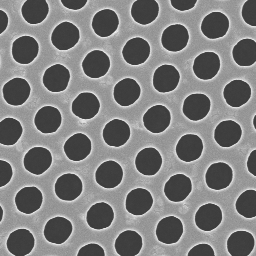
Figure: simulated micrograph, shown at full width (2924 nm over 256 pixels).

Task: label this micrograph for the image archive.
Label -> a regular array of holes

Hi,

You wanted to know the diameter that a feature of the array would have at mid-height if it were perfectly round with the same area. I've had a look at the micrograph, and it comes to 314 nm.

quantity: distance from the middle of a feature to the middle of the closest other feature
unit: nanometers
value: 465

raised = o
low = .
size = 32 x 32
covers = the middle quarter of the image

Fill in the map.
ooooo.......oooooooooooo...ooooo
.oooo......oooooooooooo.....oooo
.oooo.....oooooooooooo.......ooo
.oooooo..ooooooooooooo.......ooo
.ooooooooooooo....oooo.......ooo
.oooooooooooo......ooo......oooo
oooooooooooo.......oooo....ooooo
oooo...ooooo.......ooooooooooooo
ooo.....ooooo......oooooooooooo.
oo.......oooo.....oooooooooooo..
oo.......oooooo.oooooo...ooooo..
oo.......oooooooooooo.....oooo..
ooo.....oooooooooooo.......ooo..
oooo...ooooooooooooo.......oooo.
ooooooooooo....ooooo......oooooo
oooooooooo......oooo......oooooo
oooooooooo.......oooo....ooooooo
ooo..ooooo.......ooooooooooooooo
o.....oooo......ooooooooooooo...
.......ooo......ooooooooooooo...
.......ooooo..oooooooooooooo....
.......oooooooooooo....ooooo....
......oooooooooooo......oooo....
o....ooooooooooooo......ooooo...
oooooooooo...ooooo.......ooooooo
ooooooooo.....oooo......oooooooo
oooooooo.......ooo......oooooooo
o.oooooo.......ooooo...ooooo.ooo
....oooo.......oooooooooooo....o
....oooo......oooooooooooo......
.....oooo....oooooooooooo.......
.....oooooooooooo....oooo.......